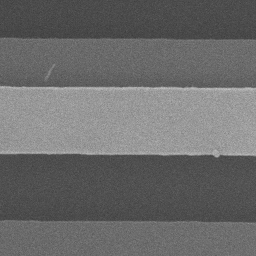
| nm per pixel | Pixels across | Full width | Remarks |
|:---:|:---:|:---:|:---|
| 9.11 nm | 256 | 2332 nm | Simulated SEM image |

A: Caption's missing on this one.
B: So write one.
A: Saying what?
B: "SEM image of lines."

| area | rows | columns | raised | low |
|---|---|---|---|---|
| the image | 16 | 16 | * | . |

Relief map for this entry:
................
................
***********.....
****************
****************
****************
****************
****************
****************
****************
................
................
................
................
****************
****************